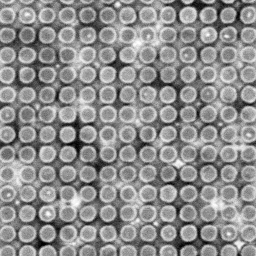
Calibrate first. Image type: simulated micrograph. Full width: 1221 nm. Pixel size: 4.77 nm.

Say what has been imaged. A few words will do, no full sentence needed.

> a regular array of raised bodies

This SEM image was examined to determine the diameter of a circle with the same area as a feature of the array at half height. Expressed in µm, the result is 0.0735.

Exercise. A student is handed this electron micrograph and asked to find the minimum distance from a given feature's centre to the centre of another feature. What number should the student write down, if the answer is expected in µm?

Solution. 0.0939